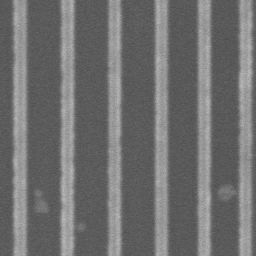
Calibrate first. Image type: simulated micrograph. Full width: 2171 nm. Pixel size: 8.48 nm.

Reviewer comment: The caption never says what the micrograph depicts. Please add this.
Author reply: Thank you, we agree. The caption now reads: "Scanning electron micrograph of lines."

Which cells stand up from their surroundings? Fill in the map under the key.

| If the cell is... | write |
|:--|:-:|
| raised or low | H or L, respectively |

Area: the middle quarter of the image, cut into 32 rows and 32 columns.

HHLLLLLLLLLHHHLLLLLLLLLHHHLLLLLL
HHLLLLLLLLLHHHLLLLLLLLLHHHLLLLLL
HHLLLLLLLLLHHHLLLLLLLLLHHHLLLLLL
HHLLLLLLLLLHHHLLLLLLLLLHHHLLLLLL
HHLLLLLLLLLHHHLLLLLLLLLHHHLLLLLL
HHLLLLLLLLLHHHLLLLLLLLLHHHLLLLLL
HHLLLLLLLLLHHHLLLLLLLLLHHHLLLLLL
HHLLLLLLLLLHHHLLLLLLLLLHHHLLLLLL
HHLLLLLLLLLHHHLLLLLLLLLHHHLLLLLL
HHLLLLLLLLLHHHLLLLLLLLLHHHLLLLLL
HHLLLLLLLLLHHHLLLLLLLLLHHHLLLLLL
HHLLLLLLLLLHHHLLLLLLLLLHHHLLLLLL
HHLLLLLLLLLHHHLLLLLLLLLHHHLLLLLL
HHLLLLLLLLLHHHLLLLLLLLLHHHLLLLLL
HHLLLLLLLLLHHHLLLLLLLLLHHHLLLLLL
HHLLLLLLLLLHHHLLLLLLLLLHHHLLLLLL
HHLLLLLLLLLHHHLLLLLLLLLHHHLLLLLL
HHLLLLLLLLLHHHLLLLLLLLLHHHLLLLLL
HHLLLLLLLLLHHHLLLLLLLLLHHHLLLLLL
HHLLLLLLLLLHHHLLLLLLLLLHHHLLLLLL
HHLLLLLLLLLHHHLLLLLLLLLHHHLLLLLL
HHLLLLLLLLLHHHLLLLLLLLLHHHLLLLLL
HHLLLLLLLLLHHHLLLLLLLLLHHHLLLLLL
HHLLLLLLLLLHHHLLLLLLLLLHHHLLLLLL
HHLLLLLLLLLHHHLLLLLLLLLHHHLLLLLL
HHLLLLLLLLLHHHLLLLLLLLLHHHLLLLLL
HHLLLLLLLLLHHHLLLLLLLLLHHHLLLLLL
HHLLLLLLLLLHHHLLLLLLLLLHHHLLLLLL
HHLLLLLLLLLHHHLLLLLLLLLHHHLLLLLL
HHLLLLLLLLLHHHLLLLLLLLLHHHLLLLLL
HHLLLLLLLLLHHHLLLLLLLLLHHHLLLLLL
HHLLLLLLLLLHHHLLLLLLLLLHHHLLLLLL